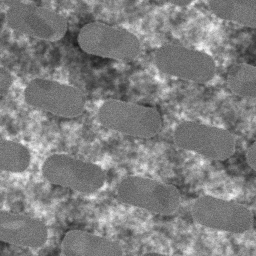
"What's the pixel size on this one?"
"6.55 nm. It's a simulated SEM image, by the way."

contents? a regular array of raised bodies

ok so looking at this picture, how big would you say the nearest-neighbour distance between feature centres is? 506 nm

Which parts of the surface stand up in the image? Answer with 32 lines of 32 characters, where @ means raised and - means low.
@@@@-----------------@@@--@@@@@@
-@@@@@@--------------------@@@@@
-@@@@@@@--------------------@@@@
-@@@@@@@--@@@@------------------
----@@@@--@@@@@@@---------------
----------@@@@@@@@--------------
-----------@@@@@@--@@@@@@-------
---------------@@--@@@@@@@@-----
--------------------@@@@@@@--@@@
@---------------------@@@@@--@@@
@--@@@@@---------------------@@@
@--@@@@@@@-------------------@@@
---@@@@@@@@---@-----------------
-----@@@@@@-@@@@@@@-------------
--------@@--@@@@@@@@------------
-------------@@@@@@@--@@@-------
---------------@@@@@--@@@@@@@---
@---------------------@@@@@@@---
@@@-------@-----------@@@@@@@--@
@@@@--@@@-----------------@@@--@
@@@@-@@@@@@@-------------------@
-@@--@@@@@@@@-------------------
------@@@@@@@--@@@@-------------
---------@@@@--@@@@@@@----------
---------------@@@@@@@---@------
----------------@@@@@@--@@@@@@--
@------------------@@@--@@@@@@@-
@@@@@-------------------@@@@@@@@
@@@@@@--------------------@@@@@-
@@@@@@--@@@@--------------------
--@@@---@@@@@@@-----------------
--------@@@@@@@-----------------